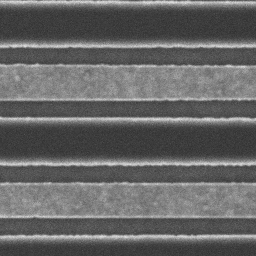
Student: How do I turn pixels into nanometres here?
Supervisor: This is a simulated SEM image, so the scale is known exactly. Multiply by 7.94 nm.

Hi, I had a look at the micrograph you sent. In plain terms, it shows lines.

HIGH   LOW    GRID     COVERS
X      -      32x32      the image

XXXXXXXXXXXXXXXXXXXXXXXXXXXXXXXX
XXXXXXXXXXXXXXXXXXXXXXXXXXXXXXXX
XXXXXXXXXXXXXXXXXXXXXXXXXXXXXXXX
XXXXXXXXXXXXXXXXXXXXXXXXXXXXXXXX
XXXXXXXXXXXXXXXXXXXXXXXXXXXXXXXX
XXXXXXXXXXXXXXXXXXXXXXXXXXXXXXXX
--------------------------------
--------------------------------
XXXXXXXXXXXXXXXXXXXXXXXXXXXXXXXX
XXXXXXXXXXXXXXXXXXXXXXXXXXXXXXXX
XXXXXXXXXXXXXXXXXXXXXXXXXXXXXXXX
XXXXXXXXXXXXXXXXXXXXXXXXXXXXXXXX
--------------------------------
--------------------------------
--------------------------------
XXXXXXXXXXXXXXXXXXXXXXXXXXXXXXXX
XXXXXXXXXXXXXXXXXXXXXXXXXXXXXXXX
XXXXXXXXXXXXXXXXXXXXXXXXXXXXXXXX
XXXXXXXXXXXXXXXXXXXXXXXXXXXXXXXX
XXXXXXXXXXXXXXXXXXXXXXXXXXXXXXXX
XXXXXXXXXXXXXXXXXXXXXXXXXXXXXXXX
--------------------------------
--------------------------------
XXXXXXXXXXXXXXXXXXXXXXXXXXXXXXXX
XXXXXXXXXXXXXXXXXXXXXXXXXXXXXXXX
XXXXXXXXXXXXXXXXXXXXXXXXXXXXXXXX
XXXXXXXXXXXXXXXXXXXXXXXXXXXXXXXX
--------------------------------
--------------------------------
-----X---XX-X-XX-XXXX-XXXXXXXXXX
XXXXXXXXXXXXXXXXXXXXXXXXXXXXXXXX
XXXXXXXXXXXXXXXXXXXXXXXXXXXXXXXX